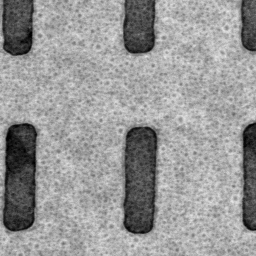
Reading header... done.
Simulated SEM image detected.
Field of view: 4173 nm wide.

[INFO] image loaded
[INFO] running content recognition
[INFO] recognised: holes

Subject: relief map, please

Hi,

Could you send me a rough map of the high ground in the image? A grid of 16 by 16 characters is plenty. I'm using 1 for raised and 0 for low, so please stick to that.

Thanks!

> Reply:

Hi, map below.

0011111100111110
0011111100111110
0011111100111110
1111111111111111
1111111111111111
1111111111111111
1111111111111111
1111111111111111
0011111100111110
0011111100111110
0011111100111110
0011111100111110
0011111100111110
0011111100111110
1111111101111111
1111111111111111